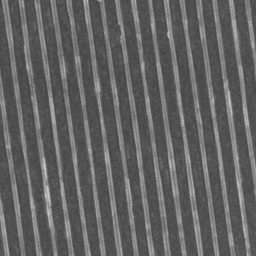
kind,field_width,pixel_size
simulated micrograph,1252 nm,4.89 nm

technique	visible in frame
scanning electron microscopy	parallel lines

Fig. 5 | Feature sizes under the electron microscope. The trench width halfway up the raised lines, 0.0594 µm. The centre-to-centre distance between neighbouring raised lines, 0.0782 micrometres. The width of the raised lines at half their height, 18.2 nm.